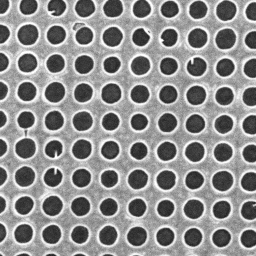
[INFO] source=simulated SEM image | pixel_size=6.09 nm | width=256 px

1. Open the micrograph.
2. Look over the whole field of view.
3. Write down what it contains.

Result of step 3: a regular array of holes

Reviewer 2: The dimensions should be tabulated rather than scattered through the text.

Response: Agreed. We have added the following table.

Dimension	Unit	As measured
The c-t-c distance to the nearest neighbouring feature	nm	170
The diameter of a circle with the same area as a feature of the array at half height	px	19.9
